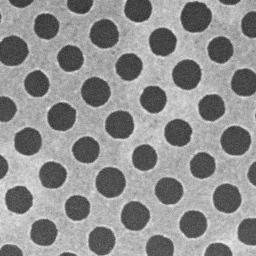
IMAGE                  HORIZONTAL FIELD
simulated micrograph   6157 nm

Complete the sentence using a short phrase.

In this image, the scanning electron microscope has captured a regular array of holes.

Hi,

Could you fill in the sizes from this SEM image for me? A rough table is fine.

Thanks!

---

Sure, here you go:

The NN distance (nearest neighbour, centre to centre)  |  0.986 micrometres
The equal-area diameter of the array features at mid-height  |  0.698 µm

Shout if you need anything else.